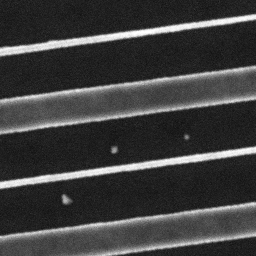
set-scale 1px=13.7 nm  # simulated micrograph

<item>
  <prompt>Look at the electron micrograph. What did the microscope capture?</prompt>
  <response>lines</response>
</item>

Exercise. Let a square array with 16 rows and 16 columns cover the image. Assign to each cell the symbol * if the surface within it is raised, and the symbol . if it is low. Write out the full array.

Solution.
................
................
................
................
.............***
.....***********
**************..
******..........
................
................
................
................
................
..........******
..**************
**********......